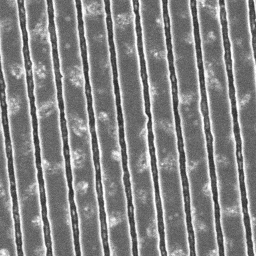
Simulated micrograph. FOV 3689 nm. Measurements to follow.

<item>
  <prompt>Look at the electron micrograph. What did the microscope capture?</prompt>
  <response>parallel lines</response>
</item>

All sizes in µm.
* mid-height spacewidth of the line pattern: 0.0895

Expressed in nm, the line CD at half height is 317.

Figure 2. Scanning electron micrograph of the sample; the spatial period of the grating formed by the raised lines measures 412 nm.